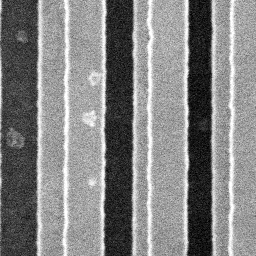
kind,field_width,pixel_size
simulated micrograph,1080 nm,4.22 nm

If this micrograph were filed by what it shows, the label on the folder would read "lines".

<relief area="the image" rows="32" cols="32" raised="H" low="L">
LLLLLHHHHHHHHLLLLHHHHHHLLLLHHHHH
LLLLLHHHHHHHHLLLLHHHHHHLLLLHHHHH
LLLLLHHHHHHHHLLLLHHHHHHLLLLHHHHH
LLLLLHHHHHHHHLLLLHHHHHHLLLLHHHHH
LLLLLHHHHHHHHLLLLHHHHHHLLLLHHHHH
LLLLLHHHHHHHHLLLLHHHHHHLLLLHHHHH
LLLLLHHHHHHHHLLLLHHHHHHLLLLHHHHH
LLLLLHHHHHHHHLLLLHHHHHHLLLLHHHHH
LLLLLHHHHHHHHLLLLHHHHHHLLLLHHHHH
LLLLLHHHHHHHHLLLLHHHHHHLLLLHHHHH
LLLLLHHHHHHHHLLLLHHHHHHLLLLHHHHH
LLLLLHHHHHHHHLLLLHHHHHHLLLLHHHHH
LLLLLHHHHHHHHLLLLHHHHHHLLLLHHHHH
LLLLLHHHHHHHHLLLLHHHHHHLLLLHHHHH
LLLLLHHHHHHHHLLLLHHHHHHLLLLHHHHH
LLLLLHHHHHHHHLLLLHHHHHHLLLLHHHHH
LLLLLHHHHHHHHLLLLHHHHHHLLLLHHHHH
LLLLLHHHHHHHHLLLLHHHHHHLLLLHHHHH
LLLLLHHHHHHHHLLLLHHHHHHLLLLHHHHH
LLLLLHHHHHHHHLLLLHHHHHHLLLLHHHHH
LLLLLHHHHHHHHLLLLHHHHHHLLLLHHHHH
LLLLLHHHHHHHHLLLLHHHHHHLLLLHHHHH
LLLLLHHHHHHHHLLLLHHHHHHLLLLHHHHH
LLLLLHHHHHHHHLLLLHHHHHHLLLLHHHHH
LLLLLHHHHHHHHLLLLHHHHHHLLLLHHHHH
LLLLLHHHHHHHHLLLLHHHHHHLLLLHHHHH
LLLLLHHHHHHHHLLLLHHHHHHLLLLHHHHH
LLLLLHHHHHHHHLLLLHHHHHHLLLLHHHHH
LLLLLHHHHHHHHLLLLHHHHHHLLLLHHHHH
LLLLLHHHHHHHHLLLLHHHHHHLLLLHHHHH
LLLLLHHHHHHHHLLLLHHHHHHLLLLHHHHH
LLLLLHHHHHHHHLLLLHHHHHHLLLLHHHHH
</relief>